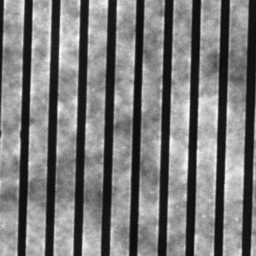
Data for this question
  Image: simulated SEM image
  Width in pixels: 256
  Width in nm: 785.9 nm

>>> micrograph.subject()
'parallel lines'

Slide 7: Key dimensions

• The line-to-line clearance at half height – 28.7 nm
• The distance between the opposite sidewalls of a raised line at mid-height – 57.5 nm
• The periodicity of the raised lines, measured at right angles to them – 86.2 nanometers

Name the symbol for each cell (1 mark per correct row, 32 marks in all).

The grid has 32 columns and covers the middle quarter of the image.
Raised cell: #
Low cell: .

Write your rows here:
####..####...####...#####..#####
####..####...####...#####..####.
####..####...####...#####..####.
####..####...####...#####..####.
###...####...####...#####..####.
###...####...####...#####..####.
###...####...####...#####..####.
###...####...####...#####..####.
###...####...####...####...####.
###...####...####...####...####.
###...####...####..#####...####.
###...####...####..#####...####.
###...####...####..#####...####.
###...####...####..#####...####.
###...####...####..#####...####.
###...####...####..#####...####.
###..#####...####..#####...####.
###..#####..#####..#####...####.
###..#####..#####..#####...####.
###..#####..#####..#####...####.
###..#####..#####..#####..#####.
###..#####..#####..#####..#####.
###..#####..#####..#####..#####.
###..#####..#####..#####..#####.
###..#####..#####..#####..#####.
###..#####..#####..#####..#####.
###..#####..#####..#####..#####.
###..#####..#####..#####..#####.
###..#####..#####..#####..#####.
###..#####..#####..#####..#####.
###..#####..#####..#####..#####.
##...#####..#####..#####..#####.